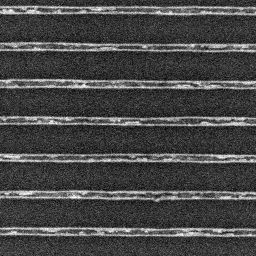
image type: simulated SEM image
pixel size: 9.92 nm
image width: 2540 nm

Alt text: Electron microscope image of parallel lines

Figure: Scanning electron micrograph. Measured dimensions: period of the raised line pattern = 367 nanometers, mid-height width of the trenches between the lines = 300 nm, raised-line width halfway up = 68.2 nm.